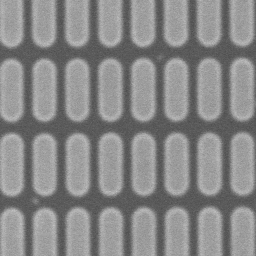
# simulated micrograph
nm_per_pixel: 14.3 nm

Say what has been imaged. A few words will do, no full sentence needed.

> groups of lines, slits or small figures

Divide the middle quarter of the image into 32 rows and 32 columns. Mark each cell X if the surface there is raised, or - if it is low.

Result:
-XXXXX---XXXXX---XXXXX----XXXX--
-XXXXX---XXXXX---XXXXX----XXXX--
-XXXXX---XXXXX---XXXXX----XXXX--
-XXXXX---XXXXX---XXXXX----XXXX--
-XXXXX---XXXXX---XXXXX----XXXX--
-XXXXX---XXXXX---XXXXX----XXXX--
-XXXXX---XXXXX---XXXXX----XXXX--
-XXXXX---XXXXX---XXXXX----XXXX--
-XXXXX---XXXXX---XXXXX---XXXXX--
-XXXXX---XXXXX---XXXXX---XXXXX--
-XXXXX---XXXXX---XXXXX---XXXXX--
-XXXXX---XXXXX---XXXXX---XXXXX--
-XXXXX---XXXXX----XXXX----XXXX--
--XXX-----XXX-----XXX------XX---
--------------------------------
--------------------------------
--------------------------------
--------------------------------
-XXXX-----XXXX----XXXX----XXXX--
-XXXXX---XXXXX---XXXXX----XXXX--
-XXXXX---XXXXX---XXXXX----XXXX--
-XXXXX---XXXXX---XXXXX----XXXXX-
-XXXXX---XXXXX---XXXXX----XXXXX-
-XXXXX---XXXXX---XXXXX----XXXXX-
-XXXXX---XXXXX---XXXXX----XXXXX-
-XXXXX---XXXXX---XXXXX----XXXXX-
-XXXXX---XXXXX---XXXXX----XXXXX-
-XXXXX---XXXXX---XXXXX----XXXXX-
-XXXXX---XXXXX---XXXXX----XXXXX-
-XXXXX---XXXXX---XXXXX----XXXXX-
-XXXXX---XXXXX---XXXXX----XXXXX-
-XXXXX----XXXX----XXXX----XXXX--